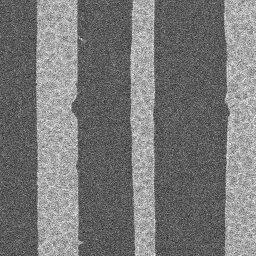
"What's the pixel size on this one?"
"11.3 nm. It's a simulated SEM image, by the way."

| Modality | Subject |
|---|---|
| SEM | one or a few lines or trenches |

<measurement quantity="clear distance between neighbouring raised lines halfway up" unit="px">65.3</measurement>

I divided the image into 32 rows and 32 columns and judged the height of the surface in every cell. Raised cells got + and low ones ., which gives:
.....+++++.......++.........++++
.....+++++.......++.........++++
.....+++++.......++.........++++
.....+++++.......++.........++++
.....+++++.......++.........++++
.....+++++.......++.........++++
.....+++++......+++.........++++
.....+++++......+++.........++++
.....+++++......+++.........++++
.....+++++......+++.........++++
.....+++++......+++..........+++
.....+++++......+++.........++++
.....++++.......+++.........++++
.....++++.......+++..........+++
.....++++.......+++..........+++
.....+++++......+++..........+++
.....+++++......+++..........+++
.....+++++.......++..........+++
.....+++++.......++.........++++
.....+++++.......++.........++++
.....++++........++.........++++
.....+++++.......++.........++++
.....+++++.......++.........++++
.....+++++.......++.........++++
.....+++++.......++.........++++
.....+++++.......++.........++++
.....+++++.......++.........++++
.....+++++.......++.........++++
.....+++++.......++.........++++
.....+++++.......++.........++++
.....+++++.......++.........++++
.....+++++.......++.........++++